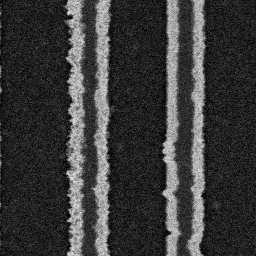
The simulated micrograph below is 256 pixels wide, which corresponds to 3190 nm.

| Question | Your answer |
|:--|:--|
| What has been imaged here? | one or a few lines or trenches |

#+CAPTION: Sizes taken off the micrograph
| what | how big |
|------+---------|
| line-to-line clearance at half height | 858 nm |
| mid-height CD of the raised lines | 27.1 pixels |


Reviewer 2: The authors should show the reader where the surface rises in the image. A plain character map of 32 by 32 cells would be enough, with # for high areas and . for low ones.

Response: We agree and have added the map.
.........####.........###.......
..........###.........###.......
.........####.........###.......
..........###.........###.......
..........###.........###.......
..........###.........###.......
..........###.........###.......
.........####.........###.......
.........####.........###.......
.........####.........###.......
.........####.........###.......
.........####........####.......
.........####.........###.......
.........####.........###.......
.........####........####.......
.........####........####.......
.........####........####.......
.........####........####.......
..........###........####.......
..........###........####.......
.........####........####.......
.........####........####.......
.........####.........###.......
.........####........####.......
.........####........####.......
.........####.........###.......
.........####........####.......
.........####.........###.......
.........####.........###.......
..........###.........###.......
..........###........###........
.........####.........##........